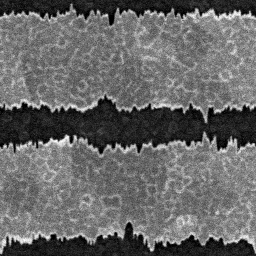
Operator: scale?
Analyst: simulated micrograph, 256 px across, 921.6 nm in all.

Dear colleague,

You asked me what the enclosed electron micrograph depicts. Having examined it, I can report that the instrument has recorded one or a few lines or trenches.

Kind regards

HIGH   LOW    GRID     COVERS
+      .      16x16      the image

................
++++++++++++++++
++++++++++++++++
++++++++++++++++
++++++++++++++++
++++++++++++++++
+.++++.+++++++++
................
................
++++++++++++++++
++++++++++++++++
++++++++++++++++
++++++++++++++++
++++++++++++++++
++++++++.+++++++
................